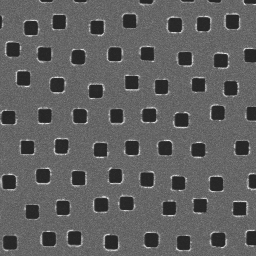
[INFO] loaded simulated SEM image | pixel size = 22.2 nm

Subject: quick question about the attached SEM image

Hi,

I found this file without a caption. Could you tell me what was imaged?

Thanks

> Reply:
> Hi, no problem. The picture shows a regular array of holes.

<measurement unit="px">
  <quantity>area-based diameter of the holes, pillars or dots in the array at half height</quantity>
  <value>15.3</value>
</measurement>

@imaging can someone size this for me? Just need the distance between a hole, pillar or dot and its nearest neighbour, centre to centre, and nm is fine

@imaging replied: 682